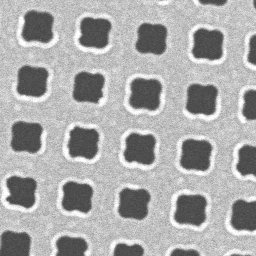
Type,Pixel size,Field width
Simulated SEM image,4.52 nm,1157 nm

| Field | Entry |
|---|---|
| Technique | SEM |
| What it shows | a regular array of holes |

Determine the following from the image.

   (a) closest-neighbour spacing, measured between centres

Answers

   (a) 249 nm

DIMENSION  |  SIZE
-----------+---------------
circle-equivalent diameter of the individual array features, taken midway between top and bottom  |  146 nanometres